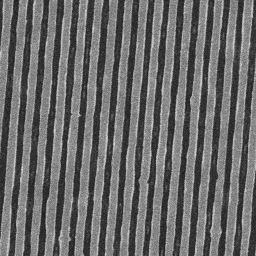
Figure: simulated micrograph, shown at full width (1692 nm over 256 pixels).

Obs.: parallel lines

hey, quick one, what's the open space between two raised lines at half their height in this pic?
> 6.85 px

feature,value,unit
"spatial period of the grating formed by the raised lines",99.1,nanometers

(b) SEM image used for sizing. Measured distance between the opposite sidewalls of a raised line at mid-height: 0.0511 µm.